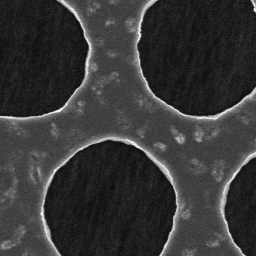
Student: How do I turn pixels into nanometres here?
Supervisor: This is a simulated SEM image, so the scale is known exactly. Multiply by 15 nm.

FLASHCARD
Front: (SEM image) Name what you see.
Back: holes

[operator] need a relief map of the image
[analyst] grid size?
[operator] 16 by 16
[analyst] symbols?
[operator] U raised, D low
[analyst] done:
DDDDUUUUUDDDDDDD
DDDDDUUUUDDDDDDD
DDDDDUUUUDDDDDDD
DDDDDUUUUDDDDDDD
DDDDDUUUUDDDDDDD
DDDDDUUUUDDDDDDD
DDDDUUUUUUDDDDDU
UUUUUUUUUUUUUUUU
UUUUUUUUUUUUUUUU
UUUUUDDDDUUUUUUU
UUUUDDDDDDUUUUUD
UUUDDDDDDDDUUUDD
UUUDDDDDDDDUUUDD
UUUDDDDDDDDUUUDD
UUUDDDDDDDDUUUDD
UUUUDDDDDDUUUUUD